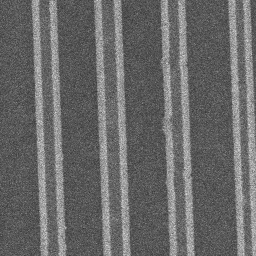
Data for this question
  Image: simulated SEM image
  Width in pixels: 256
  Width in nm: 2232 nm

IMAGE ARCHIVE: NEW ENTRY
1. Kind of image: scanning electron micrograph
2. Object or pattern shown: one or a few lines or trenches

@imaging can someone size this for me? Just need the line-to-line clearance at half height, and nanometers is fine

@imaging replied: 397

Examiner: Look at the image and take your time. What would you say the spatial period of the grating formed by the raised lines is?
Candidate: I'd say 64.9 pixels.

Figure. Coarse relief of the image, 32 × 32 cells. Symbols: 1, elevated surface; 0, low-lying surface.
00001110000011100000011000000110
00001110000011100000011000000110
00001110000011100000011000000110
00000110000011100000011000000110
00000110000011100000011000000110
00000110000011100000011000000110
00000110000011100000011000000110
00000110000001100000011000000110
00000110000001100000011000000110
00000110000001100000011000000110
00000110000001100000011000000110
00000110000001100000011000000110
00000110000001100000011000000110
00000110000001100000011000000110
00000110000001100000011000000110
00000110000001100000011000000010
00000110000001100000011000000010
00000110000001100000011000000011
00000110000001100000011000000011
00000110000001100000011000000011
00000110000001110000011000000011
00000110000001110000011000000011
00000111000001110000011100000011
00000111000001110000011100000011
00000111000001110000011100000011
00000111000001110000011100000011
00000111000001110000011100000011
00000111000001110000011100000011
00000111000001110000011100000011
00000111000001110000001100000011
00000111000001110000001100000011
00000111000001110000001100000011